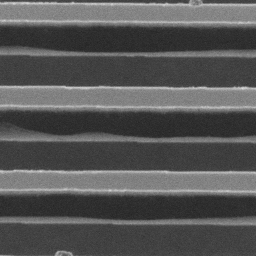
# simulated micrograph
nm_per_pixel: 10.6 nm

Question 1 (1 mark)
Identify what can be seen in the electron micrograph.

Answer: lines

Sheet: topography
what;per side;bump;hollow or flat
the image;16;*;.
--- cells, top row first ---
****************
................
................
****************
****************
****************
****************
................
................
****************
****************
****************
................
................
****************
****************